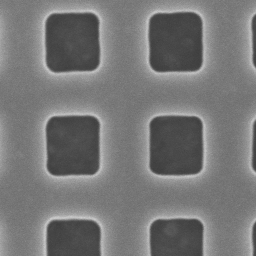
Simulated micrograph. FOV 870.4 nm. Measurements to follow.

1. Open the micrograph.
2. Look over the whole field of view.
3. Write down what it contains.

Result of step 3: holes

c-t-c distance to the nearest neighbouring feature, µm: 0.35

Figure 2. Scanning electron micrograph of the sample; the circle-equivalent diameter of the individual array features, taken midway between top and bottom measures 0.215 um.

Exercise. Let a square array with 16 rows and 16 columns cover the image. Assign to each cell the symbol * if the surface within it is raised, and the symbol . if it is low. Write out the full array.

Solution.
****************
***...***....***
***...***....***
***...***....***
***.******..****
****************
****************
***...****..****
***...***....***
***...***....***
***...***....***
****************
****************
****************
***...***....***
***...***....***